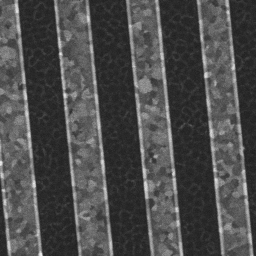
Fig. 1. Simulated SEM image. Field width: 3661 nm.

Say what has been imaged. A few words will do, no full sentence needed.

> one or a few lines or trenches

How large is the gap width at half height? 578 nm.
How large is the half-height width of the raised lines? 418 nanometers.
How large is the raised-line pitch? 70.4 pixels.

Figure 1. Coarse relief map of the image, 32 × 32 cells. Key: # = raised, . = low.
##.....####.....####.....###....
##.....####.....####.....###....
##.....####.....####.....####...
##.....####.....####.....####...
##.....####.....####.....####...
###.....###......###.....####...
###.....###......###.....####...
###.....####.....###......###...
###.....####.....###......###...
###.....####.....####.....###...
###.....####.....####.....###...
###.....####.....####.....###...
###.....####.....####.....####..
###.....####.....####.....####..
###.....####.....####.....####..
###.....####.....####.....####..
####.....###......###.....####..
####.....####.....###......###..
####.....####.....###......###..
####.....####.....###......###..
####.....####.....####.....###..
####.....####.....####.....###..
####.....####.....####.....####.
####.....####.....####.....####.
####.....####.....####.....####.
.###.....####.....####.....####.
.####.....###......###.....####.
.####.....####.....###......###.
.####.....####.....###......###.
.####.....####.....###......###.
.####.....####.....####.....###.
.####.....####.....####.....###.